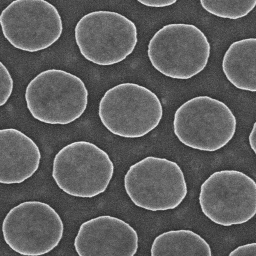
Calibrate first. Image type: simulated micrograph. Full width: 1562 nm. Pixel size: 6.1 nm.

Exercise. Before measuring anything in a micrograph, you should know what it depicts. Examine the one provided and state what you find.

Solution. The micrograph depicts raised bodies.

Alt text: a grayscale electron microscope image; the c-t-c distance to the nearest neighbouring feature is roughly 456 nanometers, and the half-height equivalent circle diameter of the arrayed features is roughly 349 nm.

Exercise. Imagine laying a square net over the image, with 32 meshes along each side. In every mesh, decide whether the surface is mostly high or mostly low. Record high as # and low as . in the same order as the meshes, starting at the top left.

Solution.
.#####............###....#######
#######.....##............#####.
########..######................
########..#######...#####.......
.######..########..#######......
..####....#######..#######...###
..........######...#######..####
...........####....#######..####
#...................#####...####
#....####............###....####
##..######.....##............###
#..########..######.............
#..########..#######....###.....
....#######.########..######....
....######..########..#######...
.............#######..#######...
##............####....#######..#
####...................######..#
#####...####............###.....
#####..######...................
#####..#######...#####..........
####...#######..#######....###..
###....#######..#######...######
........#####...#######..#######
..........##....#######..#######
...###...........#####...#######
.######..................#######
.#######...####............####.
########..######................
.#######..#######...#####.......
.######..########..#######.....#
..####....#######..#######...###